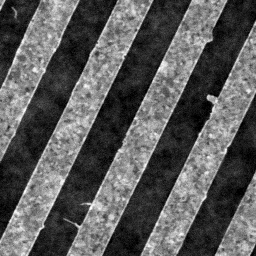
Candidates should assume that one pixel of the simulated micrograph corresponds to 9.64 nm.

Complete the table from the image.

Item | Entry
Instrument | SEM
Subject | one or a few lines or trenches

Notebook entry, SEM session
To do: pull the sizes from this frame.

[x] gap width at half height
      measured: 0.338 micrometres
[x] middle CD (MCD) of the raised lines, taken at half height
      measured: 0.303 um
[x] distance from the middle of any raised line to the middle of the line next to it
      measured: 641 nm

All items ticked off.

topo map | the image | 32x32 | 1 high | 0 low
00000111110000011110000011110000
00001111100000111100000111110000
00001111100000111100000111100000
00011111000001111000001111100000
00011111000001111000001111000001
00011110000011110000011111000001
00111110000011110000011110000011
00111100000111100000111110000011
01111100000111100000111100000111
01111000001111000000111100000111
11111000001111000001111000001111
11110000011110000001111000001111
11110000011110000011110000111110
11100000111110000011110000011110
11100000111100000111100000111110
11000001111100000111100000111100
11000001111000001111000001111100
10000011111000001111000001111000
10000011110000011110000011110000
00000111110000111110000011110000
00000111100000111100000111100000
00001111100000111100000111100000
00001111000001111000001111100000
00011111000001111000001111000001
00011110000011110000011111000001
00111110000111110000011110000011
00111100000111100000111110000011
01111100000111100000111100000111
01111000001111000001111100000111
11111000001111000001111000001111
11110000011110000011111000001111
11110000011110000011110000011110